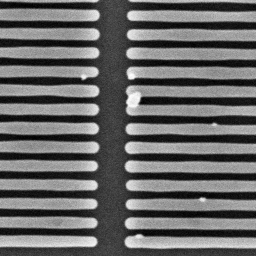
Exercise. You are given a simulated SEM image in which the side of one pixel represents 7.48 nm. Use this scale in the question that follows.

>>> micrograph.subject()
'groups of lines, slits or small figures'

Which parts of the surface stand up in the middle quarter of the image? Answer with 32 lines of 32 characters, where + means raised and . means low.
................................
++++++++........++++++++++++++++
++++++++........++++++++++++++++
....+...........+...............
................................
++++++..........................
+++++++++.......++++++++++++++++
++++++++........++++++++++++++++
................+++.............
................+++.............
++++++++........++++++++++++++++
+++++++++.......++++++++++++++++
++++++++........++++++++++++++++
................................
................................
++++++++........++++++++++++++++
+++++++++.......++++++++++++++++
.......+........+++++++.....++++
................................
................................
+++++++++.......++++++++++++++++
++++++++........++++++++++++++++
................................
................................
++++++++........+++++++++....+++
++++++++.......+++++++++++++++++
++++++++........++++++++++++++++
................................
................................
++++++++........++++++++++++++++
++++++++........++++++++++++++++
.................+++++++++++++++